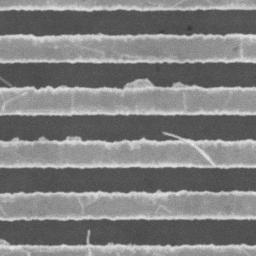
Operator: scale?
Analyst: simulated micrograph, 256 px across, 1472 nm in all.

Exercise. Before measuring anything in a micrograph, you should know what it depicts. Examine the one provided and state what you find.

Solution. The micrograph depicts lines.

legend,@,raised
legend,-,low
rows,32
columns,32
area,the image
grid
@@@@@@@@@@@@@@@@@@@@@@@@@@@@@@@@
--------------------------------
--------------------------------
--------------------------------
-@@@-------------@@@@@--@@@-@@@@
@@@@@@@@@@@@@@@@@@@@@@@@@@@@@@@@
@@@@@@@@@@@@@@@@@@@@@@@@@@@@@@@@
@@@@@@@@@@@@@@@@@@@@@@@@@@@@@@@@
--------------------------------
--------------------------------
--------------------------------
@@@@@@@@@@@@@@@@@@@@@@@@@@@@@@@@
@@@@@@@@@@@@@@@@@@@@@@@@@@@@@@@@
@@@@@@@@@@@@@@@@@@@@@@@@@@@@@@@@
--------------------------------
--------------------------------
--------------------------------
-----------------------@--------
@@@@@@@@@@@@@@@@@@@@@@@@@@@@@@@@
@@@@@@@@@@@@@@@@@@@@@@@@@@@@@@@@
@@@@@@@@@@@@@@@@@@@@@@@@@@@@@@@@
--------------------------------
--------------------------------
--------------------------------
@@@@@@@@@@@@@@@@@@@@@@@@@@@@@@@@
@@@@@@@@@@@@@@@@@@@@@@@@@@@@@@@@
@@@@@@@@@@@@@@@@@@@@@@@@@@@@@@@@
--------------------------------
--------------------------------
--------------------------------
--------------------------------
@@@@@@@@@@@@@@@@@@@@@@@@@@@@@@@@